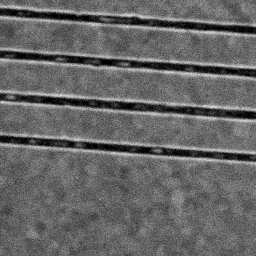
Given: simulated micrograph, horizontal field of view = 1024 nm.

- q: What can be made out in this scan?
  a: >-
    parallel lines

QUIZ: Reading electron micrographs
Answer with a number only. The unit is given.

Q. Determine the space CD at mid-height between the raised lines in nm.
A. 38.9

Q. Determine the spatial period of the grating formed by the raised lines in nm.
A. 170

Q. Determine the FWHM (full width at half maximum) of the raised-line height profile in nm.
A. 132